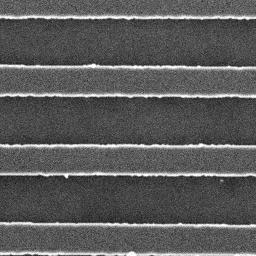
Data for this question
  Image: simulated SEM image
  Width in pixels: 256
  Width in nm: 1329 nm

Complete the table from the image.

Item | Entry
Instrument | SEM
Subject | lines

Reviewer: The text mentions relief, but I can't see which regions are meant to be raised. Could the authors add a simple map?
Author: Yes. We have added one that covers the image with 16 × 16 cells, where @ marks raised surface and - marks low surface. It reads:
@@@@@@@@@@@@@@@@
----------------
----------------
----------------
@@@@@@@@@@@@@@@@
@@@@@@@@@@@@@@@@
----------------
----------------
----------------
@@@@@@@@@@@@@@@@
@@@@@@@@@@@@@@@@
----------------
----------------
----------------
@@@@@@@@@@@@@@@@
@@@@@@@@@@@@@@@@